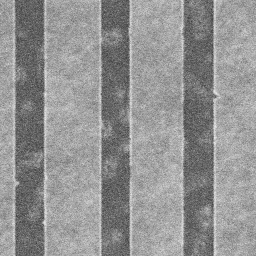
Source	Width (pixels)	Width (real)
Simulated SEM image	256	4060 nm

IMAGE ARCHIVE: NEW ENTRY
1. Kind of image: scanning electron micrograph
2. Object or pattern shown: one or a few lines or trenches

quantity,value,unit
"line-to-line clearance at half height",488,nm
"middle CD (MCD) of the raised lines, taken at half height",851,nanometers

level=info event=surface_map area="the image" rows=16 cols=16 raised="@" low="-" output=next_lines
@--@@@--@@@--@@@
@--@@@--@@@--@@@
@--@@@--@@@--@@@
@--@@@--@@@--@@@
@--@@@--@@@--@@@
@--@@@--@@@--@@@
@--@@@--@@@--@@@
@--@@@--@@@--@@@
@--@@@--@@@--@@@
@--@@@--@@@--@@@
@--@@@--@@@--@@@
@--@@@--@@@--@@@
@--@@@--@@@--@@@
@--@@@--@@@--@@@
@--@@@--@@@--@@@
@--@@@--@@@--@@@